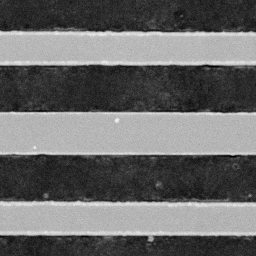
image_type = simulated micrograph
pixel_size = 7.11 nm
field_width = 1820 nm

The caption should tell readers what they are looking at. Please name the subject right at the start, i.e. lines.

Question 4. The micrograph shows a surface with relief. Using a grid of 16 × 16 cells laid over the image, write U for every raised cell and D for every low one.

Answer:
DDDDDDDDDDDDDDDD
DDDDDDDDDDDDDDDD
UUUUUUUUUUUUUUUU
UUUUUUUUUUUUUUUU
DDDDDDDDDDDDDDDD
DDDDDDDDDDDDDDDD
DDDDDDDDDDDDDDDD
UUUUUUUUUUUUUUUU
UUUUUUUUUUUUUUUU
UUUUUUUUUUUUUUUU
DDDDDDDDDDDDDDDD
DDDDDDDDDDDDDDDD
DDDDDDDDDDDDDDDD
UUUUUUUUUUUUUUUU
UUUUUUUUUUUUUUUU
DDDDDDDDDDDDDDDD